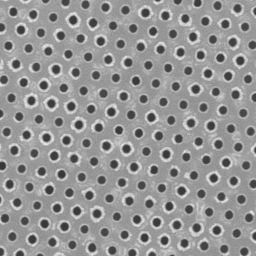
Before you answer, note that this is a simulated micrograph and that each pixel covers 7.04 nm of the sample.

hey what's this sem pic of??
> a regular array of holes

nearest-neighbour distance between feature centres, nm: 139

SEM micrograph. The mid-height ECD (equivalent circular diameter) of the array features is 63.5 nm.